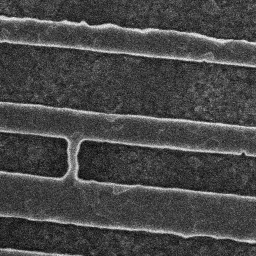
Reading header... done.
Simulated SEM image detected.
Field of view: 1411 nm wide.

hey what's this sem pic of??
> one or a few lines or trenches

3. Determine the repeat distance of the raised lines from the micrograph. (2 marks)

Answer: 82.5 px